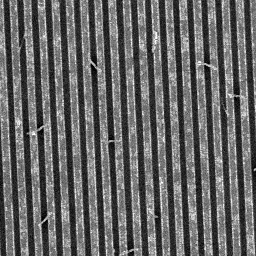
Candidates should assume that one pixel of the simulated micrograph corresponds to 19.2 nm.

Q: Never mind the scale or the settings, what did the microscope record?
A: parallel lines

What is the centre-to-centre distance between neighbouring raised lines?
272 nm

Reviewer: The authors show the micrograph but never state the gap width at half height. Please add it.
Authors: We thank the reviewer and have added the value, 137 nm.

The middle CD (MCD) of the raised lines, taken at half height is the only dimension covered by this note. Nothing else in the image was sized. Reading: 137 nm